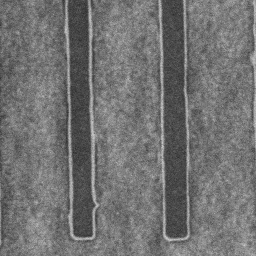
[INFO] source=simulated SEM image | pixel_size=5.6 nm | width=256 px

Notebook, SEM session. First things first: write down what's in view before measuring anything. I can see one or a few lines or trenches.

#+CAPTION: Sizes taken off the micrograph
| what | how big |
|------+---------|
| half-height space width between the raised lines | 391 nm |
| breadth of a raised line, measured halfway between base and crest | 136 nanometers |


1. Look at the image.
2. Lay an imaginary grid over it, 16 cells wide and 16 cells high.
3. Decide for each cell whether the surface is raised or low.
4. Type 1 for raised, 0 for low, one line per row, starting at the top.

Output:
0000110000110000
0000110000110000
0000110000110000
0000110000110000
0000110000110000
0000110000110000
0000110000110000
0000110000110000
0000110000110000
0000110000110000
0000110000110000
0000110000110000
0000110000110000
0000110000110000
0000010000110000
0000000000000000